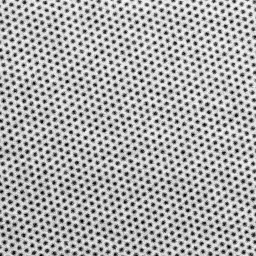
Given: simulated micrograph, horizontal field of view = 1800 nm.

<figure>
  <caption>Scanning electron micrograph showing a regular array of holes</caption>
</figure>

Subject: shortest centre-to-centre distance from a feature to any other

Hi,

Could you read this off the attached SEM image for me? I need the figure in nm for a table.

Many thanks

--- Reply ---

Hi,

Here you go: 52.5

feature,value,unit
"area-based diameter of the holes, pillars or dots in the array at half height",0.0355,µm